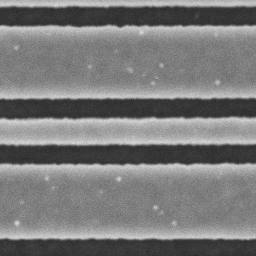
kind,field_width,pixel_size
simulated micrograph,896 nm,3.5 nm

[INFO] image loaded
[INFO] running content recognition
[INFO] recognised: lines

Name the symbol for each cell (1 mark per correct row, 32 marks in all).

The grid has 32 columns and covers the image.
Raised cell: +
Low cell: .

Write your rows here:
++++++++++++++++++++++++++++++++
................................
................................
++++++++++++++++++++++++++++++++
++++++++++++++++++++++++++++++++
++++++++++++++++++++++++++++++++
++++++++++++++++++++++++++++++++
++++++++++++++++++++++++++++++++
++++++++++++++++++++++++++++++++
++++++++++++++++++++++++++++++++
++++++++++++++++++++++++++++++++
++++++++++++++++++++++++++++++++
................................
................................
................................
++++++++++++++++++++++++++++++++
++++++++++++++++++++++++++++++++
++++++++++++++++++++++++++++++++
................................
................................
.....................+......+..+
++++++++++++++++++++++++++++++++
++++++++++++++++++++++++++++++++
++++++++++++++++++++++++++++++++
++++++++++++++++++++++++++++++++
++++++++++++++++++++++++++++++++
++++++++++++++++++++++++++++++++
++++++++++++++++++++++++++++++++
++++++++++++++++++++++++++++++++
++++++++++++++++++++++++++++++++
................................
................................